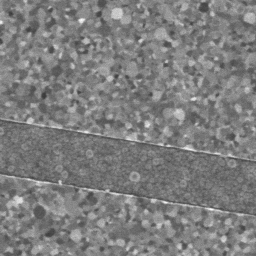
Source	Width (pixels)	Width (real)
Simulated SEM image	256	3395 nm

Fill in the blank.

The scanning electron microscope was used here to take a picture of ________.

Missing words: one or a few lines or trenches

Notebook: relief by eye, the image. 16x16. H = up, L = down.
HHHHHHHHHHHHHHHH
HHHHHHHHHHHHHHHH
HHHHHHHHHHHHHHHH
HHHHHHHHHHHHHHHH
HHHHHHHHHHHHHHHH
HHHHHHHHHHHHHHHH
HHHHHHHHHHHHHHHH
HHHHHHHHHHHHHHHH
LLLLLLHHHHHHHHHH
LLLLLLLLLLLLLHHH
LLLLLLLLLLLLLLLL
HHHHLLLLLLLLLLLL
HHHHHHHHHHLLLLLL
HHHHHHHHHHHHHHHH
HHHHHHHHHHHHHHHH
HHHHHHHHHHHHHHHH